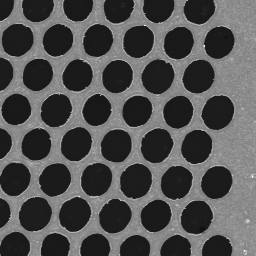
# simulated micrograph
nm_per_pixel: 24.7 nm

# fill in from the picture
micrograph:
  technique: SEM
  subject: a regular array of holes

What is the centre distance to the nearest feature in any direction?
975 nm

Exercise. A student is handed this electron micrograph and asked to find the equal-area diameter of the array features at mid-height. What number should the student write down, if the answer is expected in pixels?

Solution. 32.1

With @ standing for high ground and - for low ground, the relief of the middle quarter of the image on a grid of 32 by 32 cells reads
@------@@@@------@@@@------@@@@-
-------@@@-------@@@-------@@@--
-------@@--------@@@--------@@--
-------@@--------@@---------@@--
-------@@@-------@@--------@@@--
------@@@@-------@@@-------@@@--
@----@@@@@@----@@@@@@-----@@@@@-
@@@@@@@@-@@@@@@@@@@@@@@-@@@@@@@@
-@@@@@-----@@@@@-----@@@@@@----@
--@@@------@@@@-------@@@@------
--@@@-------@@@-------@@@-------
--@@@-------@@--------@@@-------
--@@@-------@@--------@@@-------
-@@@@------@@@@-------@@@-------
-@@@@@----@@@@@------@@@@-------
@@@@@@@@@@@@@@@@---@@@@@@@-----@
@-----@@@@@@--@@@@@@@@----@@@@@@
-------@@@------@@@@@-----@@@@@-
-------@@@-------@@@-------@@@--
-------@@--------@@--------@@@--
-------@@--------@@--------@@---
-------@@--------@@--------@@---
------@@@-------@@@-------@@@@--
@----@@@@@------@@@@------@@@@--
@@@@@@@@@@@@--@@@@@@@---@@@@@@@-
@@@@@@-----@@@@@----@@@@@@@@-@@@
-@@@@-------@@@------@@@@@-----@
-@@@@-------@@--------@@@-------
--@@--------@@--------@@--------
--@@--------@@--------@@--------
-@@@-------@@@--------@@--------
-@@@@------@@@-------@@@-------@